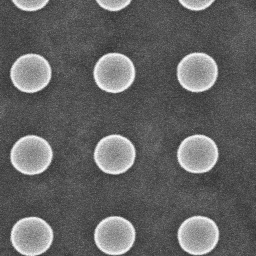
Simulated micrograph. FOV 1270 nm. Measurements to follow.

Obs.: a regular array of raised bodies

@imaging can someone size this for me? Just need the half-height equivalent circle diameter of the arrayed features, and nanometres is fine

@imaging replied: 192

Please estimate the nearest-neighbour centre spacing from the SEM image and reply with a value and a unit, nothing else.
404 nanometers